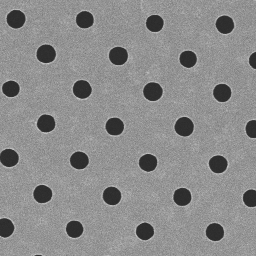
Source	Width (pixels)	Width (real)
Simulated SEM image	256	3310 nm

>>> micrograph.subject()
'a regular array of holes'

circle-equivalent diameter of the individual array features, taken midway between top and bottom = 0.233 micrometres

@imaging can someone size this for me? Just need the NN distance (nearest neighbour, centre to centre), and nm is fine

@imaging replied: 622